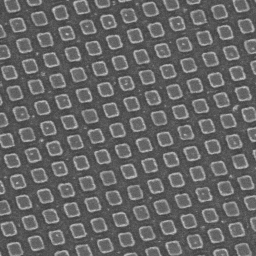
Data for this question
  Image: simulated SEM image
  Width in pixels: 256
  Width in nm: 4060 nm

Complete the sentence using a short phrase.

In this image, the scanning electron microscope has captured a regular array of raised bodies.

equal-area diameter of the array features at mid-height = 14.9 pixels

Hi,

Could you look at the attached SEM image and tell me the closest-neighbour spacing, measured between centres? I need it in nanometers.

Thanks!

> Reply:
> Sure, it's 337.